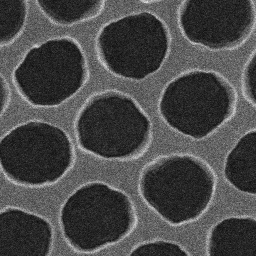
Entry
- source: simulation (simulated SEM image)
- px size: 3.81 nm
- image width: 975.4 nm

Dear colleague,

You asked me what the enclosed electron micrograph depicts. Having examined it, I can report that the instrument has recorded holes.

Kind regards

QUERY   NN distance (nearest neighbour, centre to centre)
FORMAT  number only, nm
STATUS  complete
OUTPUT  321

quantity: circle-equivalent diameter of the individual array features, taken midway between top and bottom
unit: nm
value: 256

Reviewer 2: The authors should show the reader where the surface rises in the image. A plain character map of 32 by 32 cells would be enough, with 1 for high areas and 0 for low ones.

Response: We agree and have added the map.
00011000000011111111111000000001
00011100000011111111111000000000
00011110001111100000111000000000
00011111111110000000011000000001
00111111111110000000011000000001
11111000011100000000011110000111
11110000001110000000011111111111
11100000001110000000111111111110
11000000001111000000111111111110
11000000001111100011111000011110
01000000001111111111100000001110
01100000011111111111100000000110
01110000111000001111000000000111
11111111111000000111000000000111
11111111110000000011000000001111
11100011110000000001100000001111
10000000110000000001111000111111
00000000110000000011111111111100
00000000011000000011111111111000
00000000011110001111111111111000
00000000011111111110000001110000
10000000111111111100000000110000
11000001111111111100000000011000
11111111110000111100000000011100
11111111100000001100000000111111
11111111000000001110000000111111
00011111000000001111000001111111
00000111000000000111100111110000
00000011000000001111111111100000
00000011000000011111111111000000
00000011100001111100001111000000
00000011111111111000000111000000